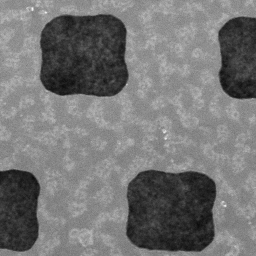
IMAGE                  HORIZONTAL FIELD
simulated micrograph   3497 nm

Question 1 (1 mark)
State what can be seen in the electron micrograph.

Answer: holes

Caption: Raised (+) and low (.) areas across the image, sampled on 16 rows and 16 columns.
++++++++++++++++
+++.....++++++..
+++.....++++++..
+++.....++++++..
+++.....++++++..
+++.....++++++..
++++++++++++++++
++++++++++++++++
++++++++++++++++
++++++++++++++++
++++++++++++++++
..++++++.....+++
..++++++.....+++
..++++++.....+++
..++++++.....+++
..+++++++....+++